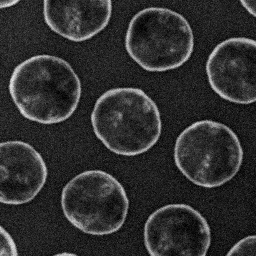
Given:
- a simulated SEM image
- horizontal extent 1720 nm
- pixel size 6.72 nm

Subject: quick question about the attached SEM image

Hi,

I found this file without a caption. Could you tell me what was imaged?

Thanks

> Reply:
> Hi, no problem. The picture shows raised bodies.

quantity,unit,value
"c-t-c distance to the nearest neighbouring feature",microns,0.587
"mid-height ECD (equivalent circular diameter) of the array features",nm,439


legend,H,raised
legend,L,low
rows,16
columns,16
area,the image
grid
LLLHHHHLLLLLLLLH
LLLHHHHLHHHHLLLL
LLLLLLLLHHHHLLLL
LLLLLLLLHHHHLHHH
LHHHHLLLLLLLLHHH
LHHHHLLLLLLLLHHH
LHHHHLHHHHLLLLLL
LLHHLLHHHHLLLLLL
LLLLLLHHHHLHHHHL
HHLLLLLHHLLHHHHL
HHHLLLLLLLLHHHHL
HHHLHHHLLLLLHHLL
HHLLHHHHLLLLLLLL
LLLLHHHHLLHHLLLL
LLLLLHHLLHHHHLLL
HLLLLLLLLHHHHLLH